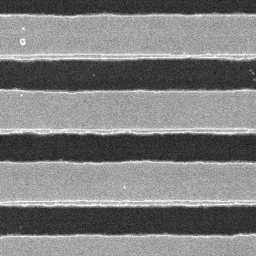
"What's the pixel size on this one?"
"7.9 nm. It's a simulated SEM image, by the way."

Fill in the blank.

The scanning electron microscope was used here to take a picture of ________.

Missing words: lines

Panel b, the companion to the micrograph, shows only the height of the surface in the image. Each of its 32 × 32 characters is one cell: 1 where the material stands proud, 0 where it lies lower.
00000000000000000000000000000000
00000000000000000000000000000000
11111111111111111111111111111111
11111111111111111111111111111111
11111111111111111111111111111111
11111111111111111111111111111111
11111111111111111111111111111111
00000000000000000000000000000000
00000000000000000000000000000000
00000000000000000000000000000000
00000000000000000000000000000000
11111100001111111111111111111111
11111111111111111111111111111111
11111111111111111111111111111111
11111111111111111111111111111111
11111111111111111111111111111111
11101111111111111111111111111111
00000000000000000000000000000000
00000000000000000000000000000000
00000000000000000000000000000000
11111111111111111111111111111111
11111111111111111111111111111111
11111111111111111111111111111111
11111111111111111111111111111111
11111111111111111111111111111111
11111111111111111111111111111001
00000000000000000000000000000000
00000000000000000000000000000000
00000000000000000000000000000000
00000000011110011011110000000111
11111111111111111111111111111111
11111111111111111111111111111111